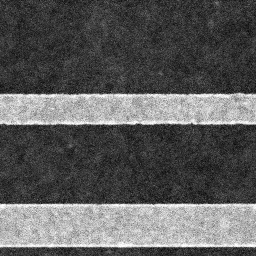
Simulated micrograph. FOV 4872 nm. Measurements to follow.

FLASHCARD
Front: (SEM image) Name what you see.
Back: one or a few lines or trenches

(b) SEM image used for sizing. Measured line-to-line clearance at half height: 1560 nm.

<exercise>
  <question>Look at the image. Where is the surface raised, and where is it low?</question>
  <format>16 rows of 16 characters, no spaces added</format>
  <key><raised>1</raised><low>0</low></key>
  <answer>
0000000000000000
0000000000000000
0000000000000000
0000000000000000
0000000000000000
0000000000000000
1111111111111111
1111111111111111
0000000000000000
0000000000000000
0000000000000000
0000000000000000
0000000000000000
1111111111111111
1111111111111111
0000000000000000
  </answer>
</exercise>